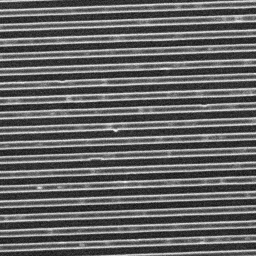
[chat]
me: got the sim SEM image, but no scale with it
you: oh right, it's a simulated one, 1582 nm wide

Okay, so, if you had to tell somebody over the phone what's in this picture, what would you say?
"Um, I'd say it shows parallel lines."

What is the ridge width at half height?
0.0409 micrometres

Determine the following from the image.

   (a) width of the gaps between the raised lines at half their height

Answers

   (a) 52.5 nanometres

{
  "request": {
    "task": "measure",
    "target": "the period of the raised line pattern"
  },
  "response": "90.5 nm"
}